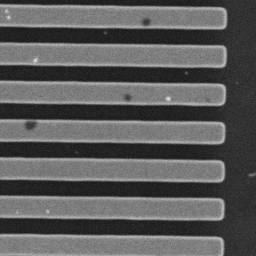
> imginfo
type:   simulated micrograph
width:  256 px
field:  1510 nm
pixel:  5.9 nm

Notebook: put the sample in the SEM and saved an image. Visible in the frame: groups of lines, slits or small figures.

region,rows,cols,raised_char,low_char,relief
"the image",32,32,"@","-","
--------------------------------
@@@@@@@@@@@@@@@@@@@@@@@@@@@@----
@@@@@@@@@@@@@@@@@@@@@@@@@@@@----
----------------------@@@@@@----
--------------------------------
@@@@@@@@@@----------------------
@@@@@@@@@@@@@@@@@@@@@@@@@@@@----
@@@@@@@@@@@@@@@@@@@@@@@@@@@@----
--------------------------------
--------------------------------
@@@@@@@@@@@@@@@@@@@@@@@@--------
@@@@@@@@@@@@@@@@@@@@@@@@@@@@----
@@@@@@@@@@@@@@@@@@@@@@@@@@@@----
--------------------------------
--------------------------------
@@@@@@@@@@@@@@@@@@@@@@@@@@@@----
@@@@@@@@@@@@@@@@@@@@@@@@@@@@----
@@@@@@@@@@@@@@@@@@@@@@@@@@@@----
--------------------------------
--------------------------------
@@@@@@@@@@@@@@@@@@@@@@@@@@@@----
@@@@@@@@@@@@@@@@@@@@@@@@@@@@----
--------@@@@@@@@@@@@@@@@@@@@----
--------------------------------
--------------------------------
@@@@@@@@@@@@@@@@@@@@@@@@@@@@----
@@@@@@@@@@@@@@@@@@@@@@@@@@@@----
----------------------@@-@@-----
--------------------------------
@@@@@@@@@@@--@------------------
@@@@@@@@@@@@@@@@@@@@@@@@@@@@----
@@@@@@@@@@@@@@@@@@@@@@@@@@@@----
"